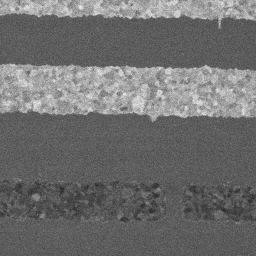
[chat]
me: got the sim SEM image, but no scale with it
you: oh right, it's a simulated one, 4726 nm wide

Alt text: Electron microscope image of one or a few lines or trenches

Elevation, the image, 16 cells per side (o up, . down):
oooooooooooooooo
................
................
................
oooooooooooooooo
oooooooooooooooo
oooooooooooooooo
................
................
................
................
oooooooooo......
oooooooooo.ooooo
oooooooooo..oooo
................
................